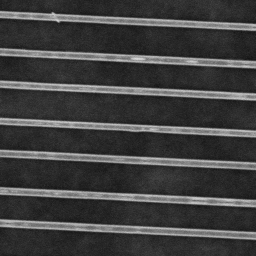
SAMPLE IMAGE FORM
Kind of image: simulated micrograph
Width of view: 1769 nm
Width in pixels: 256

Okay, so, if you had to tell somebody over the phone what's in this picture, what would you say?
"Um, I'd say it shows parallel lines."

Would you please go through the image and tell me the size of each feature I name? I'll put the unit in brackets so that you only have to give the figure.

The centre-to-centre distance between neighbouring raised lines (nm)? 240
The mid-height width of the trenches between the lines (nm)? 199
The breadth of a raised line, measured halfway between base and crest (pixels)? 5.86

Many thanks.